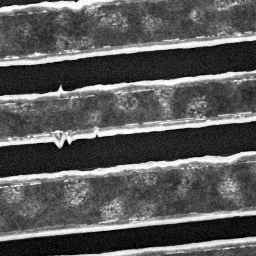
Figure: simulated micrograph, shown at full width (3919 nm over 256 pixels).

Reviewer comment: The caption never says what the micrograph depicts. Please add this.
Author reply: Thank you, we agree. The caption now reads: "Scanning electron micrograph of one or a few lines or trenches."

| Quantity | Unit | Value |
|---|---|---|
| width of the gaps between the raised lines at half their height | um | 0.504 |